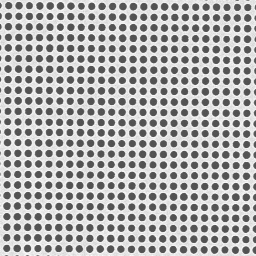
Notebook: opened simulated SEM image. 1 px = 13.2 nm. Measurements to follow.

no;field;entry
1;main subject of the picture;a regular array of holes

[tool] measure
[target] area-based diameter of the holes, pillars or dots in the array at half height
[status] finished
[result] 7.57 px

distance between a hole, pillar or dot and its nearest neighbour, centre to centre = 133 nm